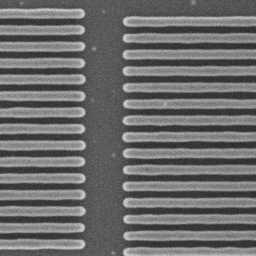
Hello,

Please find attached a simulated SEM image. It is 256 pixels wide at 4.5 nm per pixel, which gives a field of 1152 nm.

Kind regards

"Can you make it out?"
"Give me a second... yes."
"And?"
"groups of lines, slits or small figures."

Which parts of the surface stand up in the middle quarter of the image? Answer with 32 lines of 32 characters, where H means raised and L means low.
HHHHHLLLLLLLLLLLLLLLLLLLLLLLLLLL
LLLLLLLLLLLLLLLHHHHHHHHHHHHHHHHH
LLLLLLLLLLLLLLLHHHHHHHHHHHHHHHHH
HHHHHLLLLLLLLLLLLLLLLLLLLLLLLLLL
HHHHHLLLLLLLLLLLLLLLLLLLLLLLLLLL
LLLLLLLLLLLLLLLHHHHHHHHHHHHHHHHH
LLLLLLLLLLLLLLLHHHHHHHHHHHHHHHHH
HHHHHLLLLLLLLLLLLLLLLLLLLLLLLLLL
HHHHHLLLLLLLLLLLLLLLLLLLLLLLLLLL
LLLLLLLLLLLLLLLHHHHHHHHHHHHHHHHH
LLLLLLLLLLLLLLLHHHHHHHHHHHHHHHHH
HHHHHLLLLLLLLLLLLLLLLLLLLLLLLLLL
HHHHHLLLLLLLLLLLLLLLLLLLLLLLLLLL
LLLLLLLLLLLLLLLHHHHHHHHHHHHHHHHH
LLLLLLLLLLLLLLLHHHHHHHHHHHHHHHHH
HHHHHLLLLLLLLLLLLLLLLLLLLLLLLLLL
HHHHHLLLLLLLLLLLLLLLLLLLLLLLLLLL
LLLLLLLLLLLLLLLHHHHHHHHHHHHHHHHH
LLLLLLLLLLLLLLLHHHHHHHHHHHHHHHHH
HHHHHLLLLLLLLLLLLLLLLLLLLLLLLLLL
HHHHHLLLLLLLLLLLLLLLLLLLLLLLLLLL
LLLLLLLLLLLLLLLHHHHHHHHHHHHHHHHH
LLLLLLLLLLLLLLLHHHHHHHHHHHHHHHHH
LHHHLLLLLLLLLLLLLLLLLLLLLLLLLLLL
HHHHHLLLLLLLLLLLLLLLLLLLLLLLLLLL
HHHHLLLLLLLLLLLLLLHHHHHHHHHHHLHH
LLLLLLLLLLLLLLLHHHHHHHHHHHHHHHHH
HHHHHLLLLLLLLLLLLLLHHHHHLLLHHLLL
HHHHHLLLLLLLLLLLLLLLLLLLLLLLLLLL
HHHHHLLLLLLLLLLLLLLLLLLLLLLLLLLL
LLLLLLLLLLLLLLLHHHHHHHHHHHHHHHHH
LLLLLLLLLLLLLLLHHHHHHHHHHHHHHHHH